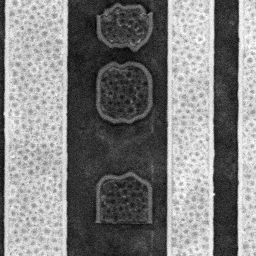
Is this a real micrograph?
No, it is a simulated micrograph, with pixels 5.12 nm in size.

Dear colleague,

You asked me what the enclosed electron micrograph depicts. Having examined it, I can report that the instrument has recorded one or a few lines or trenches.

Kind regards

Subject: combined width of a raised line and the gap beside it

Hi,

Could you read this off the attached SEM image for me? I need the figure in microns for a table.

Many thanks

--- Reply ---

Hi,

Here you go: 0.396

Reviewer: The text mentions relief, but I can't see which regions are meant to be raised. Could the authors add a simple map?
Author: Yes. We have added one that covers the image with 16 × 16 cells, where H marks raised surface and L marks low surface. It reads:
LHHHLLLHLLLHHLLH
LHHHLLHHHLLHHLLH
LHHHLLLHHLLHHLLH
HHHHLLLLLLLHHLLH
HHHHLLHHHLLHHLLH
HHHHLLHHHLLHHLLH
HHHHLLHHHLLHHLLH
HHHHLLLLLLLHHLLH
HHHHLLLLLLLHHLLH
HHHHLLLLLLLHHLLH
HHHHLLLLLLLHHLLH
HHHHLLHHHLLHHLLH
HHHHLLHHHLLHHLLH
HHHHLLHHHLLHHLLH
HHHHLLLLLLLHHLLH
HHHHLLLLLLLHHLLH